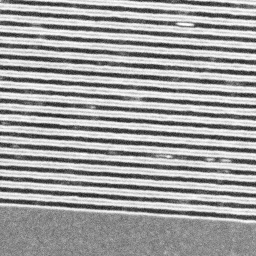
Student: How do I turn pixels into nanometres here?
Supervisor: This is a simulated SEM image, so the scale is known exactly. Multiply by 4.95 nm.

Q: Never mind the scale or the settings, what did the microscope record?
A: parallel lines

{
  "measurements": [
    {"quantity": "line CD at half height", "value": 0.0247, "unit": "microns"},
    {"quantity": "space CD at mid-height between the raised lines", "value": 0.0333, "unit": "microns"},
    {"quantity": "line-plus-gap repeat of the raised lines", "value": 54.8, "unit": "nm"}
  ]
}